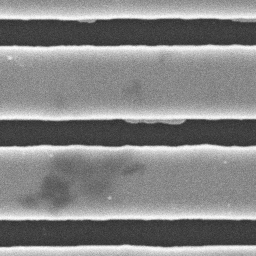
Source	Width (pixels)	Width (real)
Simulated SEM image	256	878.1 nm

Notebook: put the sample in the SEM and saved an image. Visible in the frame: lines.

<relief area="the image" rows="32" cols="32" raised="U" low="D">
UUUUUUUUUUUUUUUUUUUUUUUUUUUUUUUU
UUUUUUUUUUUUUUUUUUUUUUUUUUUUUUUU
DDDDDDDDDDDDDDDDDDDDDDDDDDDDDDDD
DDDDDDDDDDDDDDDDDDDDDDDDDDDDDDDD
DDDDDDDDDDDDDDDDDDDDDDDDDDDDDDDD
DDDDDDDDDDDDDDDDDDDDDDDDDDDDDDDD
UUUUUUUUUUUUUUUUUUUUUUUUUUUUUUUU
UUUUUUUUUUUUUUUUUUUUUUUUUUUUUUUU
UUUUUUUUUUUUUUUUUUUUUUUUUUUUUUUU
UUUUUUUUUUUUUUUUUUUUUUUUUUUUUUUU
UUUUUUUUUUUUUUUUUUUUUUUUUUUUUUUU
UUUUUUUUUUUUUUUUUUUUUUUUUUUUUUUU
UUUUUUUUUUUUUUUUUUUUUUUUUUUUUUUU
UUUUUUUUUUUUUUUUUUUUUUUUUUUUUUUU
UUUUUUUUUUUUUUUUUUUUUUUUUUUUUUUU
DDDDDDDDDDDDDDDDDDDDDDDDDDDDDDDD
DDDDDDDDDDDDDDDDDDDDDDDDDDDDDDDD
DDDDDDDDDDDDDDDDDDDDDDDDDDDDDDDD
UUUUUUUUUUUUUUUUUUUUUUUUUUUUUUUU
UUUUUUUUUUUUUUUUUUUUUUUUUUUUUUUU
UUUUUUUUUUUUUUUUUUUUUUUUUUUUUUUU
UUUUUUUUUUUUUUUUUUUUUUUUUUUUUUUU
UUUUUUUUUUUUUUUUUUUUUUUUUUUUUUUU
UUUUUUUUUUUUUUUUUUUUUUUUUUUUUUUU
UUUUUUUUUUUUUUUUUUUUUUUUUUUUUUUU
UUUUUUUUUUUUUUUUUUUUUUUUUUUUUUUU
UUUUUUUUUUUUUUUUUUUUUUUUUUUUUUUU
DDDDDDDDDDDDDDDDDDDDDDDDDDDDDDDD
DDDDDDDDDDDDDDDDDDDDDDDDDDDDDDDD
DDDDDDDDDDDDDDDDDDDDDDDDDDDDDDDD
DDDDDDDDDDDDDDDDDDDDDDDDDDDDDDDD
UUUUUUUUUUUUUUUUUUUUUUUUUUUUUUUU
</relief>